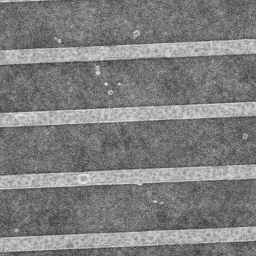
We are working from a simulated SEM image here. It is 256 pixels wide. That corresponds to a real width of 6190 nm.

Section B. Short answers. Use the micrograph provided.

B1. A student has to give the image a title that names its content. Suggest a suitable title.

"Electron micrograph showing one or a few lines or trenches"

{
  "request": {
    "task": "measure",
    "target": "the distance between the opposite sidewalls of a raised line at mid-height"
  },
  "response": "323 nanometres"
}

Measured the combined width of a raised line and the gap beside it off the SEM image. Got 1.51 micrometres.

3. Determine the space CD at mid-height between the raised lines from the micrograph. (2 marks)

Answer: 1190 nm